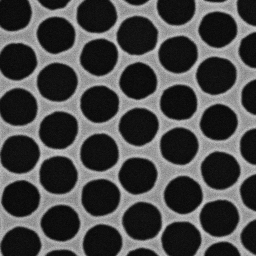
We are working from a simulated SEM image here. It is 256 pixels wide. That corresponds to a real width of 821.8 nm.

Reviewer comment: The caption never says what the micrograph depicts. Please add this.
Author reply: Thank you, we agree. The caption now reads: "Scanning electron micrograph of a regular array of holes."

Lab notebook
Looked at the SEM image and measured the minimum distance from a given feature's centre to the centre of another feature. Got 142 nm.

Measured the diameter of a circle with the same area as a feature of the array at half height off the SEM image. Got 0.123 micrometres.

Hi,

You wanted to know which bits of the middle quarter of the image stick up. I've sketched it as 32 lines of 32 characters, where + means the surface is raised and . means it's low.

.++++........+++.....++++.......
..+++.......+++.......++++.....+
...++++....+++.........+++++++++
...+++++++++++.........+++++++++
....++++++++++.........+++++++++
...+++++..++++.........++++....+
...+++......++.........++.......
..+++........++.......+++.......
.+++..........+++...++++........
++++..........++++++++++........
++++..........++++++++++........
++++..........+++....+++........
.++++........++........++.......
...+++......++.........+++.....+
...++++...++++..........++++++++
...+++++++++++..........++++++++
...+++++++++++..........++.....+
...+++++..++++.........++.......
...+++......+++........+........
..+++........+++.....+++........
.+++.........+++++.+++++........
++++..........++++++++++........
++++..........++++++++++........
.+++..........+++..++++++.......
..+++........++.......+++++....+
...++.......++.........+++++++++
...++++....+++.........+++++++++
...+++++++++++.........+++++++++
...+++++++++++.........+++++....
...+++......++.........+++......
...++........++........+++......
..+++.........+......++++.......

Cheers